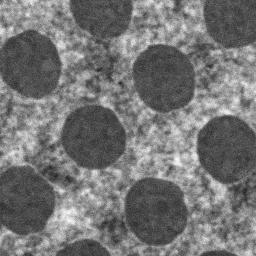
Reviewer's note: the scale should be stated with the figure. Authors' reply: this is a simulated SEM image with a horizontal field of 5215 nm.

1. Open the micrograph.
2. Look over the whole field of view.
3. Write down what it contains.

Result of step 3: raised bodies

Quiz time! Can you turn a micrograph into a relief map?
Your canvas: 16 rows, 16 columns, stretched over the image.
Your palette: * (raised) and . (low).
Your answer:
....****.....***
.....***.....***
***..........***
****.....***....
****....****....
.**.....****....
.........***....
....***......**.
....****....****
....****....****
.*...**......***
***.....***.....
***.....****....
***.....****....
.*......***.....
....***.........